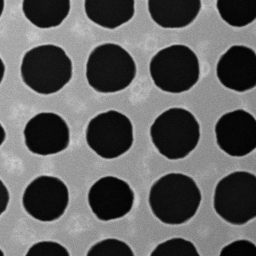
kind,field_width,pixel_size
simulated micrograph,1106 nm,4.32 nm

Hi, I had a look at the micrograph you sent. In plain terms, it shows a regular array of holes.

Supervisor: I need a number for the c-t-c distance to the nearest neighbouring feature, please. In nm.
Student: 276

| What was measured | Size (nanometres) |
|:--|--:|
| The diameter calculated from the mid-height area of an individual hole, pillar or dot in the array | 211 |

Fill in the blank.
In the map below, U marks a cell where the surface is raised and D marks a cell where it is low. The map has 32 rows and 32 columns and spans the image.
UUUDDDDDDUUDDDDDDUUDDDDDDUUDDDDD
UUUDDDDDDUUDDDDDDUUDDDDDDUUDDDDD
UUUUDDDDUUUDDDDDUUUDDDDDUUUUDDDD
UUUUUDUUUUUUUDUUUUUUUDUUUUUUUUUU
UUUUUUUUUUUUUUUUUUUUUUUUUUUUUUUU
UUUUUUUUUUUUUDUUUUUUUUUUUUUUUUUU
UUUUDDDDUUUUDDDDUUUUDDDDUUUUDDDD
UUUDDDDDDUUDDDDDDUUDDDDDDUUUDDDD
UUUDDDDDDUUDDDDDDUUDDDDDDUUDDDDD
UUUDDDDDDUUDDDDDDUUDDDDDDUUDDDDD
UUUDDDDDUUUDDDDDUUUDDDDDUUUUDDDD
UUUUUDDUUUUUUDUUUUUUUDDUUUUUUUUU
UUUUUUUUUUUUUUUUUUUUUUUUUUUUUUUU
UUUUUUUUUUUUUUUUUUUUUUUUUUUUUUUU
UUUUDDDUUUUUDDDDUUUUDDDDUUUUDDDD
UUUDDDDDUUUDDDDDUUUDDDDDDUUDDDDD
DUUDDDDDDUUDDDDDDUUDDDDDDUUDDDDD
UUUDDDDDDUUDDDDDDUUDDDDDDUUDDDDD
UUUUDDDDUUUDDDDDUUUUDDDDUUUUDDDD
UUUUUUUUUUUUUDDUUUUUUDDUUUUUUDUU
UUUUUUUUUUUUUUUUUUUUUUUUUUUUUUUU
UUUUUUUUUUUUUUUUUUUUUUUUUUUUUDDU
UUUUDDDUUUUUDDDUUUUUDDDDUUUUDDDD
DUUDDDDDUUUDDDDDUUUDDDDDDUUDDDDD
DUUDDDDDDUUDDDDDDUUDDDDDDUUDDDDD
DUUDDDDDUUUDDDDDDUUDDDDDDUUDDDDD
UUUDDDDDUUUUDDDDUUUDDDDDDUUDDDDD
UUUUUDDUUUUUUDUUUUUUDDDUUUUUDDDU
UUUUUUUUUUUUUUUUUUUUUUUUUUUUUUUU
UUUUUUUUUUUUUUUUUUUUUUUUUUUUUUUU
UUUUUDDUUUUUDDDDUUUUDDDDUUUUUDDD
UUUDDDDDUUUDDDDDUUUDDDDDDUUUDDDD